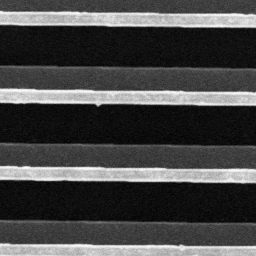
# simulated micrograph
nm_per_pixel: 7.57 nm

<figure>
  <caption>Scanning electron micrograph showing lines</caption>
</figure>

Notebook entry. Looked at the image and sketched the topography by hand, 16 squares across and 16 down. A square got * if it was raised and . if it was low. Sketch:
****************
****************
................
................
****************
****************
............****
................
................
****************
****************
................
................
................
****************
****************